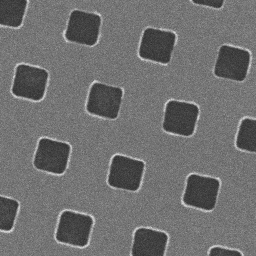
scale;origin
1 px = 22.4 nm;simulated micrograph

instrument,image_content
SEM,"a regular array of holes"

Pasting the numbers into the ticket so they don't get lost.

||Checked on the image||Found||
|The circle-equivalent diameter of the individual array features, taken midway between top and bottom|807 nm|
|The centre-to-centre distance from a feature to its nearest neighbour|1700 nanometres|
